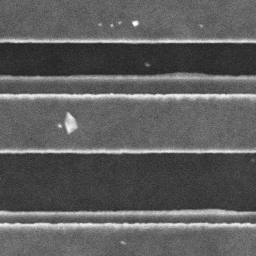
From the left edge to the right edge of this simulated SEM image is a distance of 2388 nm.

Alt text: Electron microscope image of lines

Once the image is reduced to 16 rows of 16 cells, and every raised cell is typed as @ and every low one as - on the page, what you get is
@@@@@@@@@@@@@@@@
@@@@@@@@@@@@@@@@
@@@@@@@@@@@@@@@@
----------------
----------------
@@@@@@@@@@@@@@@@
@@@@@@@@@@@@@@@@
@@@@@@@@@@@@@@@@
@@@@@@@@@@@@@@@@
@@@@@@@@@@@@@@@@
----------------
----------------
----------------
@@@@@@@@@@@@@@@@
@@@@@@@@@@@@@@@@
@@@@@@@@@@@@@@@@